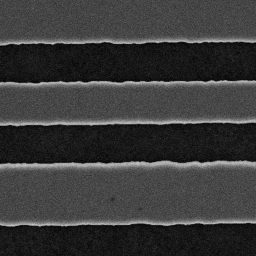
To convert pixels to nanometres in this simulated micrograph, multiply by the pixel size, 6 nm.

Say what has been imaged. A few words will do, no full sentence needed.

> lines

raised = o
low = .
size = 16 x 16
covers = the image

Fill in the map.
oooooooooooooooo
oooooooooooooooo
oooooooooooooooo
................
................
oooooooooooooooo
oooooooooooooooo
oooooooooooooooo
................
................
oooooooooooooooo
oooooooooooooooo
oooooooooooooooo
oooooooooooooooo
................
................